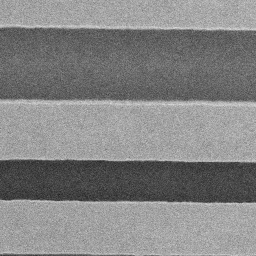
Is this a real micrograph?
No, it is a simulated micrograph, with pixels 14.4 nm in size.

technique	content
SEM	lines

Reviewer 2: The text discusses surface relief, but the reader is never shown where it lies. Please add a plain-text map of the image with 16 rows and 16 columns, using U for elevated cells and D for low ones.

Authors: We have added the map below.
UUUUUUUUUUUUUUUU
UUUUUUUUUUUUUUUU
DDDDDDDDDDDDDDDD
DDDDDDDDDDDDDDDD
DDDDDDDDDDDDDDDD
DDDDDDDDDDDDDDDD
UUUUUUUUUDDDDDDD
UUUUUUUUUUUUUUUU
UUUUUUUUUUUUUUUU
UUUUUUUUUUUUUUUU
DDDDDDDDDDDDDDDD
DDDDDDDDDDDDDDDD
DDDDDDDDDDDDDDDD
UUUUUUUUUUUUUUUU
UUUUUUUUUUUUUUUU
UUUUUUUUUUUUUUUU